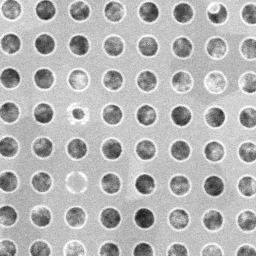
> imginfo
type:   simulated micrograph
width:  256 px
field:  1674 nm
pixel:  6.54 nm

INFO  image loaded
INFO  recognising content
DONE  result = a regular array of holes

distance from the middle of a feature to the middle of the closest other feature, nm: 223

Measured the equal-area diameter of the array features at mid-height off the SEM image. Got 0.138 um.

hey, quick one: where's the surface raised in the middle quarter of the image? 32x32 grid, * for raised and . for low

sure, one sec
********************************
**...*******.*******************
*.....****....*****....****....*
*.....****.....***.....****.....
*.....****.....***......***.....
*.....****.....***.....****.....
***..******..******...******...*
********************************
********************************
********************************
**********...******...******..**
**...*****....****.....****....*
**...****......***.....****.....
**...*****.....***.....****.....
**********....*****....****....*
********************.*******..**
********************************
********************************
********************************
*....*****....*****...*****...**
*.....***.....****.....****....*
*.....***......***.....***......
*.....****....****.....****.....
**...*****....*****...*****....*
********************************
********************************
********************************
**********...******..***********
*********.....****....*****....*
*********.....****.....***.....*
*********.....****.....***......
**********....****.....****....*